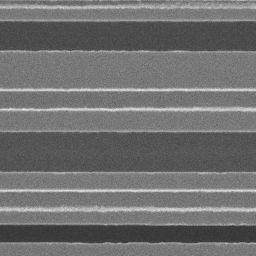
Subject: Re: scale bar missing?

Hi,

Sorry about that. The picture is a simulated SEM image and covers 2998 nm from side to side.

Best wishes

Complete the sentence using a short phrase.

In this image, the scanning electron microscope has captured lines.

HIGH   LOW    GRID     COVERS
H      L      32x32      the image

HHHHHHHHHHHHHHHHHHHHHHHHHHHHHHHH
HHHHHHHHHHHHHHHHHHHHHHHHHHHHHHHH
HHHHHHHHHHHHHHHHHHHHHHHHHHHHHHHH
LLLLLLLLLLLLLLLLLLLLLLLLLLLLLLLL
LLLLLLLLLLLLLLLLLLLLLLLLLLLLLLLL
LLLLLLLLLLLLLLLLLLLLLLLLLLLLLLLL
HHHHHHHHHHHHHHHHHHHHHHHHHHHHHHHH
HHHHHHHHHHHHHHHHHHHHHHHHHHHHHHHH
HHHHHHHHHHHHHHHHHHHHHHHHHHHHHHHH
HHHHHHHHHHHHHHHHHHHHHHHHHHHHHHHH
HHHHHHHHHHHHHHHHHHHHHHHHHHHHHHHH
HHHHHHHHHHHHHHHHHHHHHHHHHHHHHHHH
HHHHHHHHHHHHHHHHHHHHHHHHHHHHHHHH
HHHHHHHHHHHHHHHHHHHHHHHHHHHHHHHH
HHHHHHHHHHHHHHHHHHHHHHHHHHHHHHHH
HHHHHHHHHHHHHHHHHHHHHHHHHHHHHHHH
LLLLLLLLLLLLLLLLLLLLLLLLLLLLLLLL
LLLLLLLLLLLLLLLLLLLLLLLLLLLLLLLL
LLLLLLLLLLLLLLLLLLLLLLLLLLLLLLLL
LLLLLLLLLLLLLLLLLLLLLLLLLLLLLLLL
LLLLLLLLLLLLLLLLLLLLLLLLLLLLLLLL
LLLLLLLLLLLLLLLLLLLLLLLLLLLLLLLL
HHHHHHHHHHHHHHHHHHHHHHHHHHHHHHHH
HHHHHHHHHHHHHHHHHHHHHHHHHHHHHHHH
HHHHHHHHHHHHHHHHHHHHHHHHHHHHHHHH
HHHHHHHHHHHHHHHHHHHHHHHHHHHHHHHH
HHHHHHHHHHHHHHHHHHHHHHHHHHHHHHHH
HHHHHHHHHHHHHHHHHHHHHHHHHHHHHHHH
LLLLLLLLLLLLLLLLLLLLLLLLLLLLLLLL
LLLLLLLLLLLLLLLLLLLLLLLLLLLLLLLL
HHHHHHHHHHHHHHHHHHHHHHHHHHHHHHHH
HHHHHHHHHHHHHHHHHHHHHHHHHHHHHHHH